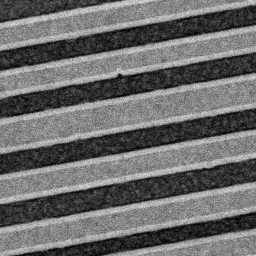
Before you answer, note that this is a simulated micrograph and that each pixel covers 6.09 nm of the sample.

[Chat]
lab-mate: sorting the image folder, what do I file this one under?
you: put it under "parallel lines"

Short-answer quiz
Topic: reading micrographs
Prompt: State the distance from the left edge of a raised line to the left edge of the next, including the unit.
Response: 0.312 um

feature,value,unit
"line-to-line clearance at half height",149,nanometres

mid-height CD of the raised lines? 0.154 microns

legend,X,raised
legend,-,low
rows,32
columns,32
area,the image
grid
--------------XXXXXXXXXXXXXXXXX-
---------XXXXXXXXXXXXXXXXX------
---XXXXXXXXXXXXXXXXX------------
XXXXXXXXXXXXXX-----------------X
XXXXXXXXX-----------------XXXXXX
XXX-----------------XXXXXXXXXXXX
---------------XXXXXXXXXXXXXXXX-
---------XXXXXXXXXXXXXXXX-------
----XXXXXXXXXXXXXXXX------------
XXXXXXXXXXXXXX-----------------X
XXXXXXXX-----------------XXXXXXX
XXX-----------------XXXXXXXXXXXX
--------------XXXXXXXXXXXXXXXXXX
---------XXXXXXXXXXXXXXXXXXXXXX-
---XXXXXXXXXXXXXXXXXXXXXX-------
XXXXXXXXXXXXXXXXXXXX------------
XXXXXXXXXXXXXX-----------------X
XXXXXXXXX----------------XXXXXXX
XXX-----------------XXXXXXXXXXXX
---------------XXXXXXXXXXXXXXXXX
---------XXXXXXXXXXXXXXXXXX-----
---XXXXXXXXXXXXXXXXXX-----------
XXXXXXXXXXXXXXX-----------------
XXXXXXXXXX-------------------XXX
XXXX-------------------XXXXXXXXX
------------------XXXXXXXXXXXXXX
------------XXXXXXXXXXXXXXXXXX--
-------XXXXXXXXXXXXXXXXXX-------
-XXXXXXXXXXXXXXXXXXX------------
XXXXXXXXXXXXXX--------------XXXX
XXXXXXXXX-------------XXXXXXXXXX
XXX--------------XXXXXXXXXXXXXXX